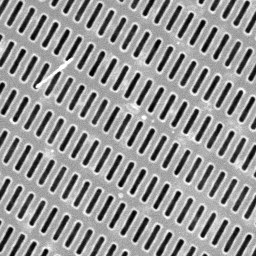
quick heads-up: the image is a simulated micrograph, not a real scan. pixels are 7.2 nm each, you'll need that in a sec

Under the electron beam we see a regular array of holes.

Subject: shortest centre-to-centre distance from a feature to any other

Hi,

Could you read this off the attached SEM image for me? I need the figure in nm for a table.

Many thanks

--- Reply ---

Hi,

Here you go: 98.8